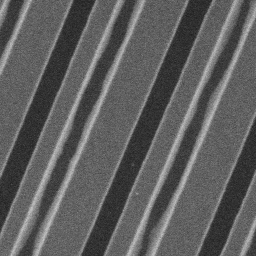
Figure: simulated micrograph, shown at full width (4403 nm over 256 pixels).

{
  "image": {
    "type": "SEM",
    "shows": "lines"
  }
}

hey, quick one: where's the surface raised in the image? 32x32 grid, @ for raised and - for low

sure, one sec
@--@@@@@@---@@@--@@@@@@---@@@@--
---@@@@@---@@@@--@@@@@@---@@@---
---@@@@@---@@@---@@@@@@--@@@@--@
--@@@@@@---@@@--@@@@@@---@@@---@
--@@@@@---@@@---@@@@@@---@@@--@@
-@@@@@@---@@@---@@@@@---@@@@--@@
-@@@@@---@@@---@@@@@@---@@@---@@
@@@@@@---@@@---@@@@@---@@@@--@@@
@@@@@@---@@---@@@@@@---@@@---@@@
@@@@@---@@@---@@@@@@---@@@--@@@@
@@@@@---@@@--@@@@@@---@@@---@@@@
@@@@---@@@---@@@@@@---@@@--@@@@@
@@@@---@@@---@@@@@---@@@---@@@@@
@@@@--@@@---@@@@@@---@@@--@@@@@@
@@@---@@@---@@@@@---@@@@--@@@@@@
@@@---@@@--@@@@@@---@@@---@@@@@-
@@---@@@---@@@@@@---@@@--@@@@@@-
@@---@@@--@@@@@@---@@@---@@@@@@-
@@--@@@---@@@@@@---@@@---@@@@@--
@---@@@---@@@@@---@@@---@@@@@@--
@---@@---@@@@@@---@@@---@@@@@---
---@@@---@@@@@---@@@@--@@@@@@---
---@@@--@@@@@@---@@@---@@@@@@---
--@@@---@@@@@@---@@@---@@@@@---@
--@@@--@@@@@@---@@@---@@@@@@---@
--@@---@@@@@@---@@@---@@@@@---@@
-@@@---@@@@@---@@@---@@@@@@---@@
-@@@--@@@@@@---@@@---@@@@@@--@@@
@@@---@@@@@@--@@@@--@@@@@@---@@@
@@@--@@@@@@---@@@---@@@@@@---@@-
@@---@@@@@@---@@@--@@@@@@---@@@-
@@---@@@@@---@@@@--@@@@@@---@@--